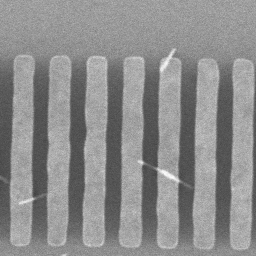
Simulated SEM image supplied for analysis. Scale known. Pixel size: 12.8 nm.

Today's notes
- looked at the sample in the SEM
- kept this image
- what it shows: groups of lines, slits or small figures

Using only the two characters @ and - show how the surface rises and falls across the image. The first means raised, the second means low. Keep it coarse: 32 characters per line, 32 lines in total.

--------------------------------
--------------------------------
--------------------------------
--------------------------------
--------------------------------
--------------------------------
--------------------------------
--@@--@@@--@@---@@--@@---@@---@-
--@@--@@@--@@---@@--@@@--@@--@@@
--@@--@@@--@@---@@--@@---@@--@@@
--@@--@@@--@@---@@--@@---@@--@@@
--@@--@@@--@@--@@@--@@---@@--@@@
--@@--@@@--@@--@@@--@@---@@--@@@
--@@--@@@--@@--@@@--@@---@@--@@@
--@@--@@@--@@--@@@--@@---@@--@@@
--@@--@@@--@@--@@@--@@--@@@--@@@
--@@--@@@--@@--@@@--@@--@@@--@@@
--@@--@@@--@@--@@@--@@--@@@--@@@
-@@@--@@@--@@--@@@--@@--@@@--@@@
-@@@--@@@--@@--@@@--@@--@@@--@@-
-@@@--@@@--@@--@@@--@@--@@@--@@-
-@@@--@@@--@@--@@@--@@--@@@--@@-
-@@@--@@---@@--@@@--@@--@@@--@@-
-@@@--@@---@@--@@@--@@--@@@--@@-
-@@@--@@---@@--@@@--@@--@@@--@@-
-@@@--@@--@@@--@@@--@@--@@@--@@-
-@@@--@@--@@@--@@@--@@--@@@--@@-
-@@@--@@--@@@--@@@--@@--@@@--@@-
-@@@--@@--@@@--@@@--@@--@@@--@@-
-@@@--@@--@@@--@@@--@@--@@@--@@-
--@---@@---@@--@@---@@--@@@--@@-
--------------------------------